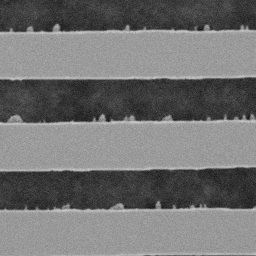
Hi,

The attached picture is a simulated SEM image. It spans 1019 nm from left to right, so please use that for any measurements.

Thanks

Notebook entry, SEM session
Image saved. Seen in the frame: lines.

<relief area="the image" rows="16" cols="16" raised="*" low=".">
................
................
****************
****************
****************
................
................
...............*
****************
****************
*************...
................
................
****************
****************
****************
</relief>